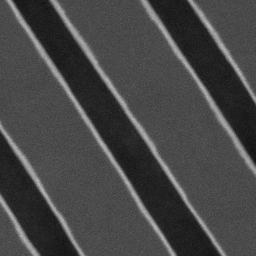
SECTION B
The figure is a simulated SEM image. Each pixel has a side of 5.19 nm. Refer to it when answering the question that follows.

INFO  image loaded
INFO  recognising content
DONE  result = lines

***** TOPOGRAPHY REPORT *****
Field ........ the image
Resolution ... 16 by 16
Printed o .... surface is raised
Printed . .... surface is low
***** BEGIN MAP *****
o..oooooo...oooo
oo..oooooo...ooo
oo...oooooo..ooo
ooo..oooooo...oo
oooo..oooooo...o
oooo...oooooo..o
ooooo...ooooo...
oooooo..oooooo..
oooooo...oooooo.
.oooooo..oooooo.
..oooooo..oooooo
..oooooo...ooooo
...oooooo..ooooo
o..oooooo...oooo
o...oooooo...ooo
oo...oooooo...oo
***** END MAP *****